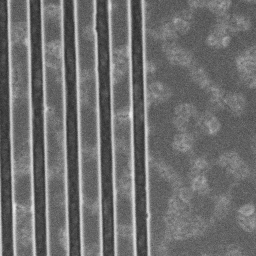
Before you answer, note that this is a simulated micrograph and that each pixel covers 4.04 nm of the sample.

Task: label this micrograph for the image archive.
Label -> parallel lines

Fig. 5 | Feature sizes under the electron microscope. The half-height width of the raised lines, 0.0847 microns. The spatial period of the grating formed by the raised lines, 136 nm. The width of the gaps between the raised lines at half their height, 0.0509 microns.